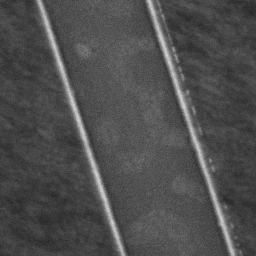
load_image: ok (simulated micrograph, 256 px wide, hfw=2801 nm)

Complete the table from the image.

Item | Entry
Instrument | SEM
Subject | one or a few lines or trenches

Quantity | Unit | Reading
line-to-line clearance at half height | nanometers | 1140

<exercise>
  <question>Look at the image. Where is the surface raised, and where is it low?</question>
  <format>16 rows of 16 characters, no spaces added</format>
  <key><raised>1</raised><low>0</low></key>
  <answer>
1110000001111111
1110000000111111
1110000000111111
1111000000111111
1111000000011111
1111000000011111
1111100000011111
1111100000001111
1111100000001111
1111110000001111
1111110000000111
1111110000000111
1111111000000111
1111111000000011
1111111000000011
1111111100000011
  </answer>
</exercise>